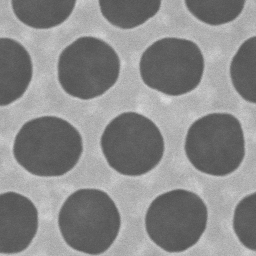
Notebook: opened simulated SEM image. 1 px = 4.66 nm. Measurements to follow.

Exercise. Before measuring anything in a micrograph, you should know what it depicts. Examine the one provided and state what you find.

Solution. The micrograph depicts holes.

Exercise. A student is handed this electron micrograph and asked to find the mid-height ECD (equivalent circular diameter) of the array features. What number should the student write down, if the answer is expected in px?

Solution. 62.4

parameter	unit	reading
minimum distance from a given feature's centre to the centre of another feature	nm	392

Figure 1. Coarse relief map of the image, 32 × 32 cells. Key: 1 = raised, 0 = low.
10000000011100000000111000000001
11000000011110000000111100000011
11000000111110000011111110000111
11110011111111100111111111111111
11111111111111111111111111111111
00111111100001111110000011111100
00011111000000011100000001111100
00001110000000011100000001111000
00001110000000011000000000111000
00001110000000011100000001111000
00001111000000111100000001111000
00011111000001111111000111111100
00111111111111111111111111111110
11111111111111111111111111111111
11111111111111100011111111000111
11100000011110000001111100000011
11000000001110000000111000000011
11000000001110000000111000000011
11000000001110000000011000000001
11000000001110000000111000000011
11000000011111000000111100000011
11110000111111100011111110000111
11111111111111111111111111111111
11111111111111111111111111111111
00011111100000111111000001111110
00001111000000111110000000111100
00000110000000011100000000111000
00000110000000011100000000111000
00000110000000011100000000111000
00001111000000011110000001111100
00001111000000111110000011111100
00011111110001111111101111111111